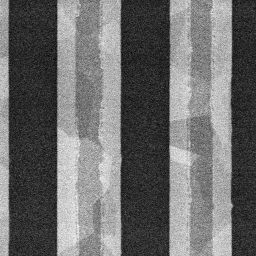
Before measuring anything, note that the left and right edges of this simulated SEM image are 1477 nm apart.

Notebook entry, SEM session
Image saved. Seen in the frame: one or a few lines or trenches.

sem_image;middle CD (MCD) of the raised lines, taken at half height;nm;272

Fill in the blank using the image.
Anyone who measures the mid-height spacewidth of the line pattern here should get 372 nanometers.